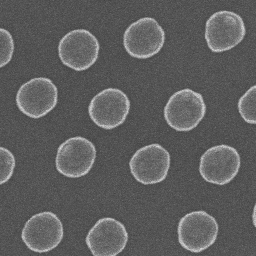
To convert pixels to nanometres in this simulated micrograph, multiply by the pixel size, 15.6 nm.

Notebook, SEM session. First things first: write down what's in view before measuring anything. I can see a regular array of raised bodies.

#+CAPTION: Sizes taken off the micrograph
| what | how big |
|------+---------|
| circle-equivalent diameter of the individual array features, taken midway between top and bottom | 608 nm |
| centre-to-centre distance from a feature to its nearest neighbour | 0.996 µm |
